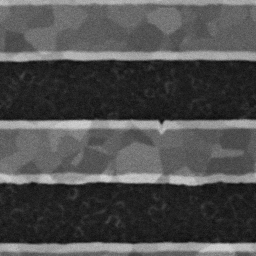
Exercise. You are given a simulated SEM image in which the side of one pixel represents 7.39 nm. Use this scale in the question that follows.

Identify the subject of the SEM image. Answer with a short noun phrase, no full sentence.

one or a few lines or trenches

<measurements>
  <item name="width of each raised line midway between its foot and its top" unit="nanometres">413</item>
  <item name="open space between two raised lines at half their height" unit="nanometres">495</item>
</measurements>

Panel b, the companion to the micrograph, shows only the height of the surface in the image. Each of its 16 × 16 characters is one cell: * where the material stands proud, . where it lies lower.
****************
****************
****************
****.*******.***
................
................
................
................
****************
****************
****************
................
................
................
................
****************